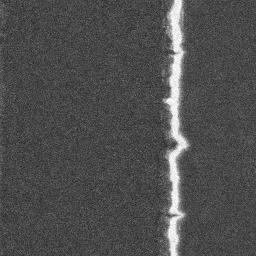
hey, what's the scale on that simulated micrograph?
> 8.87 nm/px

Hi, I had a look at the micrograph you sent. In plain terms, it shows one or a few lines or trenches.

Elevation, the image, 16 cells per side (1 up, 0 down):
0000000000011111
0000000000011111
0000000000011111
0000000000011111
0000000000011111
0000000000011111
0000000000011111
0000000000011111
0000000000011111
0000000000011111
0000000000011111
0000000000011111
0000000000011111
0000000000011111
0000000000011111
0000000000011111